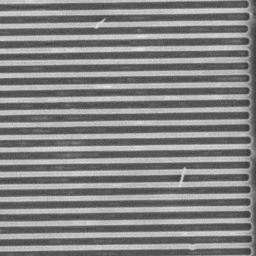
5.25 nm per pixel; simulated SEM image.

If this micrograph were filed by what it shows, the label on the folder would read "parallel lines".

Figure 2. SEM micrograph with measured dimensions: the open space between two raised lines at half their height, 0.0427 µm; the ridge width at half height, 4.5 pixels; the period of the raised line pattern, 65 nm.